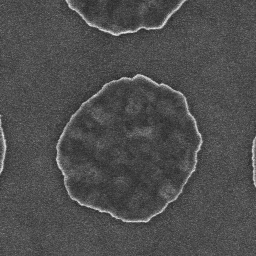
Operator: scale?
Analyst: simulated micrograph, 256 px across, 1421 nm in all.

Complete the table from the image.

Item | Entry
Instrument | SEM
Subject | raised bodies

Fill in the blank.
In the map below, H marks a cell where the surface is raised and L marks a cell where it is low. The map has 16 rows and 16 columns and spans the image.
LLLLLHHHHHHLLLLL
LLLLLLHHHHLLLLLL
LLLLLLLLLLLLLLLL
LLLLLLLLLLLLLLLL
LLLLLLLLLLLLLLLL
LLLLLLHHHHHLLLLL
LLLLLHHHHHHHLLLL
LLLLHHHHHHHHLLLL
LLLLHHHHHHHHHLLL
LLLLHHHHHHHHLLLL
LLLLHHHHHHHHLLLL
LLLLHHHHHHHHLLLL
LLLLLHHHHHHLLLLL
LLLLLLLHHHLLLLLL
LLLLLLLLLLLLLLLL
LLLLLLLLLLLLLLLL